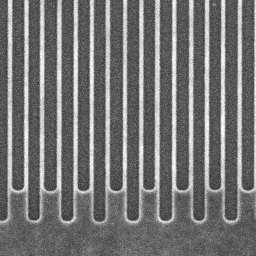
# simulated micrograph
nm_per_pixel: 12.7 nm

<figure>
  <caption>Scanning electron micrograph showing parallel lines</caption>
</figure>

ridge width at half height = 0.0461 µm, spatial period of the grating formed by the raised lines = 0.209 micrometres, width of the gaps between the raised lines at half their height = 170 nm